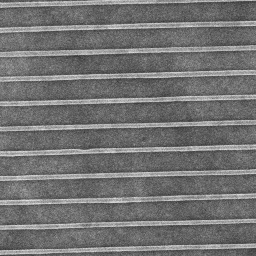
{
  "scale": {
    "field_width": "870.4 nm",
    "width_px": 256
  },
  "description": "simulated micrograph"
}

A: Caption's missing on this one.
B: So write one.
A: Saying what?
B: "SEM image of parallel lines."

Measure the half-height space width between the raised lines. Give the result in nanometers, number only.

68.4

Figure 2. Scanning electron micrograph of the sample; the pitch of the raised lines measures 83.9 nm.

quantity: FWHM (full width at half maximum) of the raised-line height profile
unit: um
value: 0.0149